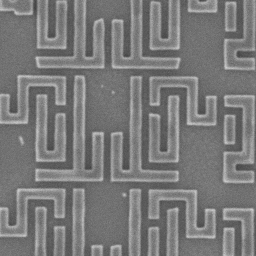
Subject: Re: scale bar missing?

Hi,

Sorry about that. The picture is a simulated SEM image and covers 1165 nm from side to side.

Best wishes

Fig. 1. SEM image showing wiring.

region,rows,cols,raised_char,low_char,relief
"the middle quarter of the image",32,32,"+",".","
++++++++++..+++++++++++++++++...
................................
................................
...++............++...++++++++++
...++............++...++++++++++
...++............++...++++++++++
...++............++...++.......+
...++............++...++.......+
...++............++...++..+++..+
...++............++...++..+++..+
...++............++.......+++..+
...++............++.......+++..+
...++............++...+...+++..+
...++............++...++..+++..+
...++............++...++..+++..+
...++............++...++..+++...
...++............++...++..+++...
..+++..+++..++...++...++..+++...
..+++..+++..+++..++...++..+++...
..+++..+++..++...++...++..+++...
..+++..+++..++...++...++..+++...
..+++..+++..++...++..+++..+++...
..+++..+++..++...++..++++++++...
..+++..+++..++...++..++++++++...
..+++..+++..++...++.............
..+++..+++..++...++.............
..+++..+++..+++.++++............
++++++++++..+++++++++++++++++...
++++++++++..+++++++++++++++++...
................................
................................
..+++............++.............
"